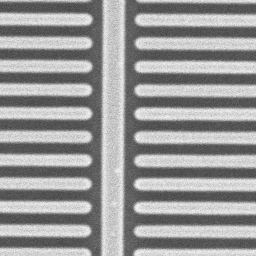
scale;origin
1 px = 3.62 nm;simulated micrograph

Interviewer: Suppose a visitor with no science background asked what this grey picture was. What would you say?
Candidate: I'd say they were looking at groups of lines, slits or small figures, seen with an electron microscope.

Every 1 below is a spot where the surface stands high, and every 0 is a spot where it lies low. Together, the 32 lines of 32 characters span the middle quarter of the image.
11111110001111100011111111111111
11111110001111100011111111111111
00000000001111100000000000000000
00000000001111100000000000000000
00000000001111100000000000000000
11111100001111100011111111111111
11111110001111100011111111111111
11111110001111100011111111111111
00000000001111100000000000000000
00000000001111100000000000000000
00000000001111100000000000000000
11111110001111100011111111111111
11111110001111100011111111111111
11111100001111100011111111111111
00000000001111100000000000000000
00000000001111100000000000000000
00000000001111100000000000000000
11111110001111100011111111111111
11111110001111100011111111111111
11111100001111100011111111111111
00000000001111100000000000000000
00000000001111100000000000000000
00000000001111100000000000000000
11111110001111100011111111111111
11111110001111100011111111111111
00001100001111100001111111111111
00000000001111100000000000000000
00000000001111100000000000000000
11000000001111100000000000000000
11111110001111100011111111111111
11111110001111100011111111111111
00000000001111100000000011111111